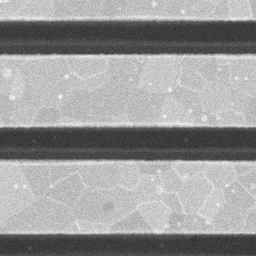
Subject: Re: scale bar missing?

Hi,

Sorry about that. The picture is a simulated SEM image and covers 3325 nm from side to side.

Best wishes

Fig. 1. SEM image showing lines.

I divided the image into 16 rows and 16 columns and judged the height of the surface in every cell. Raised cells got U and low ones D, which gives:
UUUUUUUUUUUUUUUU
DDDDDDDDDDDDDDDD
DDDDDDDDDDDDDDDD
UUUUUUUUUUUUUUUU
UUUUUUUUUUUUUUUU
UUUUUUUUUUUUUUUU
UUUUUUUUUUUUUUUU
UUUUUUUUUUUUUUUU
DDDDDDDDDDDDDDDD
DDDDDDDDDDDDDDDD
UUUUUUUUUUUUUUUU
UUUUUUUUUUUUUUUU
UUUUUUUUUUUUUUUU
UUUUUUUUUUUUUUUU
UUUUUUUUUUUUUUUU
DDDDDDDDDDDDDDDD